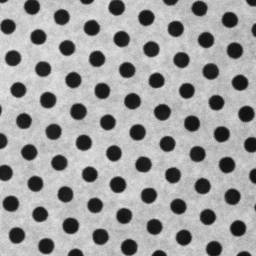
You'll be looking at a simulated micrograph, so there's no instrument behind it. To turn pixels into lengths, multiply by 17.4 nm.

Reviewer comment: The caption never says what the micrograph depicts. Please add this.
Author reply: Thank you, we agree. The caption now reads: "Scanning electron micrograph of a regular array of holes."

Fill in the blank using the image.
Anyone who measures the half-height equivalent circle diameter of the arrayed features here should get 292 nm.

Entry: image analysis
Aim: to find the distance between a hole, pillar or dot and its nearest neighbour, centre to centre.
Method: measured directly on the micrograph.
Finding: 0.543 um